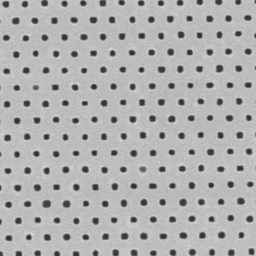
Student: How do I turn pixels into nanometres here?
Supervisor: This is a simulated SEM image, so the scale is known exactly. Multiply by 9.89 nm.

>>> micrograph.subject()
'a regular array of holes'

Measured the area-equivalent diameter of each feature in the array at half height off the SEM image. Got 70.6 nanometers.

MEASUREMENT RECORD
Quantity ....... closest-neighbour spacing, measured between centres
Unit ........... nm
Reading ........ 184